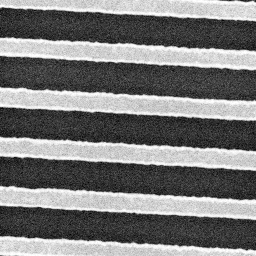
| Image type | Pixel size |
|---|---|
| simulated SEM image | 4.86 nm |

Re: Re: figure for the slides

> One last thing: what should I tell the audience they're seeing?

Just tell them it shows lines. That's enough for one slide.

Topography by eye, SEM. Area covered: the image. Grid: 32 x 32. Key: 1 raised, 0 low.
11111111111111111111111111111111
00000000000011111111111111111111
00000000000000000000000000000001
00000000000000000000000000000000
00000000000000000000000000000000
11111111111111110000000000000000
11111111111111111111111111111111
00000000000111111111111111111111
00000000000000000000000000011111
00000000000000000000000000000000
00000000000000000000000000000000
11111111110000000000000000000000
11111111111111111111111111100000
00011111111111111111111111111111
00000000000000000000011111111111
00000000000000000000000000000000
00000000000000000000000000000000
11111101000000000000000000000000
11111111111111111111111100000000
01111111111111111111111111111111
00000000000000000011111111111111
00000000000000000000000000000000
00000000000000000000000000000000
11000000000000000000000000000000
11111111111111111111110000000000
11111111111111111111111111111111
00000000000000001111111111111111
00000000000000000000000000000000
00000000000000000000000000000000
00000000000000000000000000000000
11111111111111111110000000000000
11111111111111111111111111111111